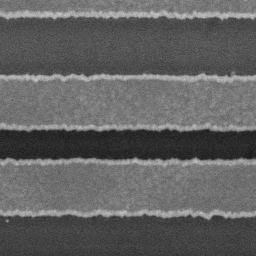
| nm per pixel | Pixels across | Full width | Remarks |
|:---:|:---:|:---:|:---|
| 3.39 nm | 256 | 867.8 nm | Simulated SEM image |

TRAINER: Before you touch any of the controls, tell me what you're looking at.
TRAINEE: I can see lines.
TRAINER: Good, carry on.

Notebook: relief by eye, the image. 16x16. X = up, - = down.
XXXXXXXXXXXXXXXX
----------------
----------------
----------------
----------------
XXXXXXXXXXXXXXXX
XXXXXXXXXXXXXXXX
XXXXXXXXXXXXXXXX
----------------
----------------
XXXXXXXXXXXXXXXX
XXXXXXXXXXXXXXXX
XXXXXXXXXXXXXXXX
-----X----X-X-XX
----------------
----------------